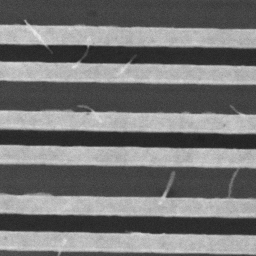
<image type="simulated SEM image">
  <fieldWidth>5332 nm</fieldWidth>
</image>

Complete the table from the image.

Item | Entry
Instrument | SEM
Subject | lines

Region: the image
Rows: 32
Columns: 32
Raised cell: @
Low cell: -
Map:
--------------------------------
--------------------------------
--------------------------------
@@@@@@@@@@@@@@@-@@--------------
@@@@@@@@@@@@@@@@@@@@@@@@@@@@@@@@
--@@@@@@@@@@@@@@@@@@@@@@@@@@@@@@
--------------------------------
--------------------------------
@@@@@@@@@@@@@@@@@@@@@@@@@@@@@@@@
@@@@@@@@@@@@@@@@@@@@@@@@@@@@@@@@
--------------------------@@@@@@
--------------------------------
--------------------------------
--------------------------------
@@@@@@@@@@@@@@@@@@@@@@@@@@@@@@@@
@@@@@@@@@@@@@@@@@@@@@@@@@@@@@@@@
----------------------@@@@@@@@@@
--------------------------------
@@@@@@@@@@@@@@@@@@--------------
@@@@@@@@@@@@@@@@@@@@@@@@@@@@@@@@
-------@@@@@@@@@@@@@@@@@@@@@@@@@
--------------------------------
--------------------------------
--------------------------------
@@@@@@@-------------@-----------
@@@@@@@@@@@@@@@@@@@@@@@@@@@@@@@@
@@@@@@@@@@@@@@@@@@@@@@@@@@@@@@@@
--------------------------------
--------------------------------
@@@@@@@@@@@@@@@@@@@@@@@@@@@@@@@@
@@@@@@@@@@@@@@@@@@@@@@@@@@@@@@@@
-------@------------@@@@@@@@@@@@